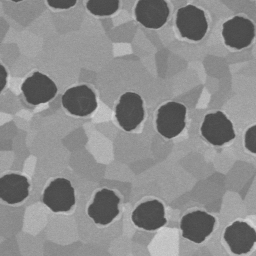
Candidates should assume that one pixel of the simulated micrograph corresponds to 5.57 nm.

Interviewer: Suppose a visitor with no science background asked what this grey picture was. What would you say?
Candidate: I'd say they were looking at a regular array of holes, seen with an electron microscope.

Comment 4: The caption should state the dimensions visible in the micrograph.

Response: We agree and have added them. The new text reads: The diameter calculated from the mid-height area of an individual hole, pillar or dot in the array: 190 nanometers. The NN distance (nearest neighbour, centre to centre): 256 nm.